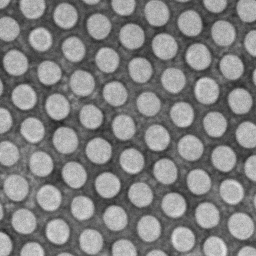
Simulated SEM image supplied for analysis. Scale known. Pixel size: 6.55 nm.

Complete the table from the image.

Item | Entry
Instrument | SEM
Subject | a regular array of raised bodies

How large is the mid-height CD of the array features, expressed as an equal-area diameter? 24.6 px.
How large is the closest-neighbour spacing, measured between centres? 0.223 um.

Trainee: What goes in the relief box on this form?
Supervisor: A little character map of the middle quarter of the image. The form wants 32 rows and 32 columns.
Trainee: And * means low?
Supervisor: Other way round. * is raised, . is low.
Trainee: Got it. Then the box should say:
........*****...******..........
.........****...******....***...
..*****..........*****...*****..
..*****..........****...******..
..******..........**....******..
..******..*****..........*****..
..*****...*****...........***...
...****...******...****.........
..........******..*****.........
*..........****...******........
*....**...........******...*****
*...*****..........*****...*****
*...*****...........***....*****
....******...****..........*****
....*****...*****...........****
.....****...******....**.....**.
**..........******...*****......
***..........****...******......
***..........****...******....**
***...*****..........*****...***
***...******.........*****...***
***...******....**....***....***
......******..*****..........***
......*****...******..........**
.......***....******...****.....
****..........******...*****....
*****..........****...******....
******...***...........*****...*
******..*****..........*****...*
*****...******..........***....*
..**....******...****..........*
........******..******..........